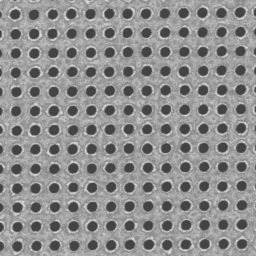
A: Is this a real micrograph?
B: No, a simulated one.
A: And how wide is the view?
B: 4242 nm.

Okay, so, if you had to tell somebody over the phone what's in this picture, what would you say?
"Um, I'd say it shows a regular array of holes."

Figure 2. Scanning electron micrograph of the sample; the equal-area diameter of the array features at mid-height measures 173 nanometers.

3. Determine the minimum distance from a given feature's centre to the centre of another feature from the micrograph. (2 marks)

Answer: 0.308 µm